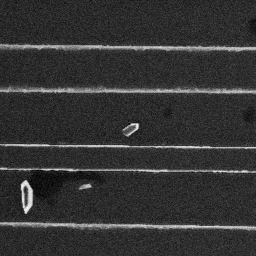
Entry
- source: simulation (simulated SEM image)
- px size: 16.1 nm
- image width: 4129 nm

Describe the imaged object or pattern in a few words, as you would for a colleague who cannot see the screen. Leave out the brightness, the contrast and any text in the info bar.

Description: lines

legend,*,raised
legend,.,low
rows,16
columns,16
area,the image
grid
................
................
................
****************
****************
****************
................
................
................
****************
****************
................
.*..............
................
****************
****************